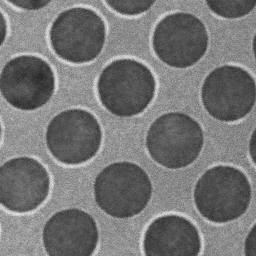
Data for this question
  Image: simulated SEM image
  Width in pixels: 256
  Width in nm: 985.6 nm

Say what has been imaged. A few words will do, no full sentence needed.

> holes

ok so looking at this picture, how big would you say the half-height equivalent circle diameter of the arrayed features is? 222 nanometers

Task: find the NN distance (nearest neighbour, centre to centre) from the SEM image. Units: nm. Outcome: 276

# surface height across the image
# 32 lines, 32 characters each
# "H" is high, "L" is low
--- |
HHLLLLHHHHHHHLLLLLLHHHHHHHLLLLLL
HHHHHHHHLLLLHHHLLLHHHHLHHHHLLLLH
LHHHHHHLLLLLLHHHHHHHLLLLLHHHHHHH
LHHHHHLLLLLLLHHHHHHLLLLLLLHHHHHH
LHHHHHLLLLLLLHHHHHHLLLLLLLHHHHHH
HHHHHHLLLLLLLHHHHHHLLLLLLLHHHHHL
HHHHHHHLLLLLLHHHHHHLLLLLLLHHHHHH
HLLLLHHHLLLLHHHLLHHHLLLLLHHHHHHH
LLLLLLHHHHHHHLLLLLHHHHLLHHHLLLHH
LLLLLLLHHHHHLLLLLLLHHHHHHHLLLLLL
LLLLLLLHHHHHLLLLLLLHHHHHHLLLLLLL
LLLLLLLHHHHHLLLLLLLHHHHHHLLLLLLL
HLLLLLHHHHHHHLLLLLLHHHHHHLLLLLLL
HHLLLHHHHLHHHLLLLLHHHHHHHLLLLLLL
HHHHHHHLLLLLHHHLLHHHLLLLHHLLLLLH
HHHHHHLLLLLLHHHHHHHLLLLLLHHHHHHH
HHHHHHLLLLLLLHHHHHLLLLLLLHHHHHHH
HHHHHHLLLLLLLHHHHHLLLLLLLLHHHHHL
HHHHHHLLLLLLHHHHHHLLLLLLLHHHHHHL
HHHHHHHLLLLLHHHHHHHLLLLLLHHHHHHL
LLLLLHHHLLHHHHLLLHHHLLLLHHHHHHHH
LLLLLLHHHHHHLLLLLLHHHHHHHHLLLLHH
LLLLLLHHHHHHLLLLLLLHHHHHHLLLLLLH
LLLLLLHHHHHHLLLLLLLHHHHHLLLLLLLH
LLLLLLHHHHHHLLLLLLLHHHHHLLLLLLLH
LLLLLHHHHHHHLLLLLLLHHHHHLLLLLLLH
HHLLHHHLLLLHHLLLLLHHHHHHHLLLLLLH
HHHHHHLLLLLLHHHHHHHLLLLHHHLLLHHH
HHHHHLLLLLLLHHHHHHHLLLLLLHHHHHHL
HHHHHLLLLLLLHHHHHHLLLLLLLHHHHHHL
HHHHHLLLLLLLHHHHHHLLLLLLLHHHHHLL
HHHHHHLLLLLLHHHHHHLLLLLLLHHHHHLL